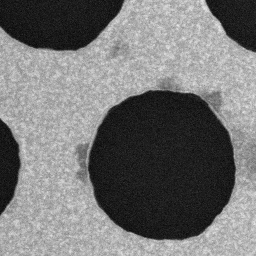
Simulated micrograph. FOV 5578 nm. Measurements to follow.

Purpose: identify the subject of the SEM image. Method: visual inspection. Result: holes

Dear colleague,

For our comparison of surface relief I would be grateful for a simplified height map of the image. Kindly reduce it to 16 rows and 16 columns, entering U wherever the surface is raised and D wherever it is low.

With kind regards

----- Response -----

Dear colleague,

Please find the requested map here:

DDDDDDDDUUUUUDDD
DDDDDDDUUUUUUUDD
UDDDDDUUUUUUUUUD
UUUUUUUUUUUUUUUU
UUUUUUUUUUUUUUUU
UUUUUUUUUUUUUUUU
UUUUUUUDDDDDDUUU
UUUUUUDDDDDDDDUU
DUUUUUDDDDDDDDUU
DUUUUUDDDDDDDDDU
DUUUUDDDDDDDDDDU
DUUUUUDDDDDDDDDU
DUUUUUDDDDDDDDUU
UUUUUUUDDDDDDDUU
UUUUUUUUDDDDDUUU
UUUUUUUUUUUUUUUU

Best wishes